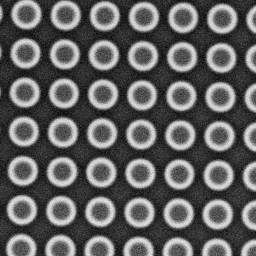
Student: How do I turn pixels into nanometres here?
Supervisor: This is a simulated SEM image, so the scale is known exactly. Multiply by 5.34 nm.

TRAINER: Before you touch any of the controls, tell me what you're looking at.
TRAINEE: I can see an array of small figures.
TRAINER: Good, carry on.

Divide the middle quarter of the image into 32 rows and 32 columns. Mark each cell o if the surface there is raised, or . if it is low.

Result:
oo.....ooooo.....ooooo.....ooooo
....................o.......ooo.
................................
................................
oo......ooo.......ooo...........
ooo....oooooo....ooooo.....ooooo
ooo...ooooooo...ooooooo...oooooo
ooo...ooooooo...ooooooo...oooooo
ooo...ooooooo...ooooooo...oooooo
ooo....oooooo...ooooooo...oooooo
oo......oooo.....ooooo.....ooooo
.............................o..
................................
................................
oo.....ooooo.....oooo.......oo..
ooo....oooooo...oooooo....oooooo
ooo...ooooooo...ooooooo...oooooo
ooo...ooooooo...ooooooo...oooooo
ooo...ooooooo...ooooooo...oooooo
ooo....ooooo....oooooo....oooooo
o.......ooo......oooo......oooo.
................................
................................
................................
oo.....ooooo.....oooo......oooo.
ooo...ooooooo...oooooo....oooooo
ooo...ooooooo...ooooooo..ooooooo
ooo...ooooooo...ooooooo..ooooooo
ooo...ooooooo...oooooo...ooooooo
oo.....ooooo....oooooo....oooooo
........ooo......oooo......oooo.
................................